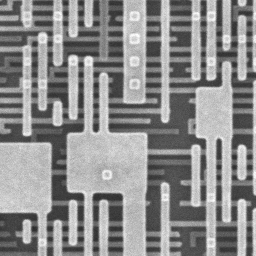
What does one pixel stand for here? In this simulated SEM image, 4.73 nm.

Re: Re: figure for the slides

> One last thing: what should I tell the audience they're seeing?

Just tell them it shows wiring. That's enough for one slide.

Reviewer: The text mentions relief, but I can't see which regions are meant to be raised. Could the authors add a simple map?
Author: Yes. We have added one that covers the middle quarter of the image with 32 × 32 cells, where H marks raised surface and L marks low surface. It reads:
LHHLLHHLLLLLLLLHHHHHLLLLLHLLLLLL
LHHLLHHLLLLLLLLHHHHHLLLLLHLLLLLL
LHHLLHHLLHHLLLLHHHHHLLLLLHLLLLLL
LHHLLHHLLHHLLLLHHHHHLLLLLHLLLLLL
LHHLLHHLLHHLLLLHHHHHLLLLLHLLLLLL
LHHLLHHLLHHLLLLHHHHHLLLLLHLLLLLL
LHHLLHHLLHHLLLLHHHHHLLLLLHLLLLLL
LHHLLHHLLHHLLLLHHHHHLLLLLHLLLLLL
LHHLLHHLLHHLLLLHHHHHLLLLLHLLLLLL
LHHLLHHLLHHLLLLHHHHHLLLLLHLLLLLL
LHHLLHHLLHHLLLLLLLLLLLLLHHLLLLLL
LHHLLHHLLHHLLLLLLLLLLLLLHHLLLLLL
LHHLLHHLLHHLLLLLLLLLLLLLHHLLLLLL
LLHLLHHLLHHLLLLLLLLLLLLLHHLLLLLL
LLLLLHHLLHHLLLLLLLLLLLLLLHLLLLLL
LLLLLHHLLHHLLLLLLLLLLLLLLLLLLLLL
LLLLLHHLLHHLLLLLLLLLLLLLLLLLLLLL
LHHHHHHHHHHHHHHHHHHHLLLLLLLLLLLL
LHHHHHHHHHHHHHHHHHHHHLLLLLLLLLLL
LHHHHHHHHHHHHHHHHHHHHLLLLLLLLLLL
LHHHHHHHHHHHHHHHHHHHHLLLLLLLLLLL
LHHHHHHHHHHHHHHHHHHHHLLLLLLLLLLL
LHHHHHHHHHHHHHHHHHHHHLLLLLLLLLLL
LHHHHHHHHHHHHHHHHHHHHLLLLLLLLLLL
LHHHHHHHHHHHHHHHHHHHHLLLLLLLLLLL
LHHHHHHHHHHHHHHHHHHHHLLLLLLLLLLL
LHHHHHHHHHHHHHHHHHHHHLLLLLLLLLLL
LHHHHHHHHHHHHHHHHHHHHLLLLLLLLLLL
LHHHHHHHHHHHHHHHHHHHHLLLLLLLLLLL
LHHHHHHHHHHHHHHHHHHHHLLLLLLLLLLL
LHHHHHHHHHHHHHHHHHHHHLLLHHLLLLLL
LHHHHHHHHHHHHHHHHHHHLLLLHHLLLLLL